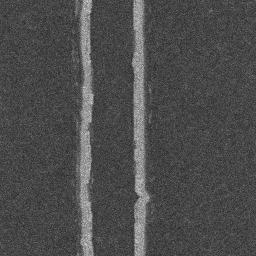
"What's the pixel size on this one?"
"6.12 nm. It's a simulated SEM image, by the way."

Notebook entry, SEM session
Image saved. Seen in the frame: one or a few lines or trenches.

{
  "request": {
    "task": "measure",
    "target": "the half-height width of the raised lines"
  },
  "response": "341 nm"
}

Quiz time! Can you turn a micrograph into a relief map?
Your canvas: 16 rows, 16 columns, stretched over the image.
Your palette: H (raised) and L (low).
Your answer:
LLLLLHHHHLLLLLLL
LLLLLHHHHLLLLLLL
LLLLLHHHHLLLLLLL
LLLLLHHHHLLLLLLL
LLLLLHHHHLLLLLLL
LLLLLHHHHLLLLLLL
LLLLLHHHHLLLLLLL
LLLLLHHHHLLLLLLL
LLLLLHHHHLLLLLLL
LLLLLHHHHLLLLLLL
LLLLLHHHHLLLLLLL
LLLLLHHHHLLLLLLL
LLLLLHHHHLLLLLLL
LLLLLHHHHLLLLLLL
LLLLLHHHHLLLLLLL
LLLLLHHHHLLLLLLL